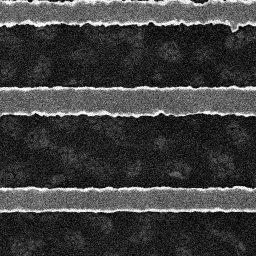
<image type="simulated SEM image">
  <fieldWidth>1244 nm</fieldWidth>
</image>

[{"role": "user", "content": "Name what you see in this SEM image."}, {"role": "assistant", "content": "one or a few lines or trenches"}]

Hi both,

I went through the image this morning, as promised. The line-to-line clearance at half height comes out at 338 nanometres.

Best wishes